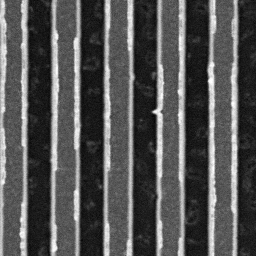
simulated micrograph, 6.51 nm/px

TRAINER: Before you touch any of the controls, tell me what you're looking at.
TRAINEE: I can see parallel lines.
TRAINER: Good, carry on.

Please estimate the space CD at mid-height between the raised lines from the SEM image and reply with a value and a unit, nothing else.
0.174 microns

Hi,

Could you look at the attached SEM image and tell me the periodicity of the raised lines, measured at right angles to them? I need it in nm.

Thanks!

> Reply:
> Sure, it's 341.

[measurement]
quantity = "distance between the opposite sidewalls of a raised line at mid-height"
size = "0.168 micrometres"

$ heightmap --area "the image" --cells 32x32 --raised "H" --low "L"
HHHLLLLHHHLLLHHHLLLLHHHLLLHHHLLL
HHHLLLLHHHLLLHHHLLLLHHHLLLHHHLLL
HHHLLLLHHHLLLHHHLLLLHHHLLLHHHHLL
HHHLLLLHHHLLLHHHLLLLHHHLLLHHHHLL
HHHLLLLHHHLLLHHHLLLLHHHLLLHHHHLL
HHHLLLLHHHLLLHHHLLLLHHHLLLHHHLLL
HHHLLLLHHHLLLHHHLLLLHHHLLLHHHLLL
HHHLLLLHHHLLLHHHLLLLHHHLLLHHHHLL
HHHLLLLHHHLLLHHHLLLLHHHLLLHHHHLL
HHHLLLLHHHLLLHHHHLLLHHHLLLHHHLLL
HHHLLLLHHHLLLHHHHLLLHHHLLLHHHLLL
HHHLLLLHHHLLLHHHLLLLHHHLLLHHHHLL
HHHLLLLHHHLLLHHHLLLLHHHLLLHHHHLL
HHHLLLLHHHLLLHHHLLLLHHHLLLHHHLLL
HHHLLLLHHHLLLHHHLLLLHHHLLLHHHLLL
HHHLLLLHHHLLLHHHLLLLHHHLLLHHHHLL
HHHLLLLHHHLLLHHHLLLLHHHLLLHHHLLL
HHHLLLLHHHLLLHHHLLLLHHHLLLHHHLLL
HHHLLLLHHHLLLHHHLLLLHHHLLLHHHHLL
HHHLLLLHHHLLLHHHLLLLHHHLLLHHHHLL
HHHLLLLHHHLLLHHHLLLLHHHLLLHHHHLL
HHHLLLLHHHLLLHHHLLLLHHHLLLHHHHLL
HHHLLLLHHHLLLHHHLLLLHHHLLLHHHHLL
HHHLLLLHHHLLLHHHLLLLHHHLLLHHHLLL
HHHLLLLHHHLLLHHHLLLLHHHLLLHHHLLL
HHHLLLLHHHLLLHHHLLLLHHHLLLHHHLLL
HHHLLLLHHHLLLHHHLLLLHHHLLLHHHLLL
HHHLLLLHHHLLLHHHLLLLHHHLLLHHHLLL
HHHLLLLHHHLLLHHHLLLLHHHLLLHHHLLL
HHHLLLLHHHLLLHHHLLLLHHHLLLHHHLLL
HHHLLLLHHHLLLHHHLLLLHHHLLLHHHLLL
HHHLLLLHHHLLLHHHLLLLHHHLLLHHHLLL